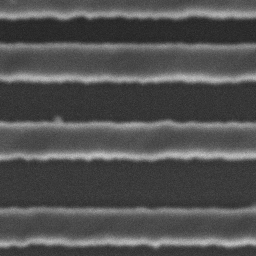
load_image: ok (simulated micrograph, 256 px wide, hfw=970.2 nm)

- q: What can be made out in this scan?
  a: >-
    lines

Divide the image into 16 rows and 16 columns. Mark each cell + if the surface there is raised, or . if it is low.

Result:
++++++++++++++++
................
................
++++++++++++++++
++++++++++++++++
................
................
................
++++++++++++++++
++++++++++++++++
................
................
................
++++++++++++++++
++++++++++++++++
................